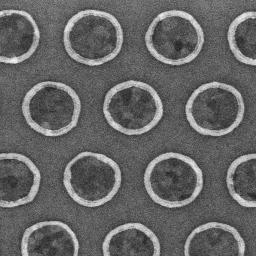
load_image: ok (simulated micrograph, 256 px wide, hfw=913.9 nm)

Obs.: raised bodies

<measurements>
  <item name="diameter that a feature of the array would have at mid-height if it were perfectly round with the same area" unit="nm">191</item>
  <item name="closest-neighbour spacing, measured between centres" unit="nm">290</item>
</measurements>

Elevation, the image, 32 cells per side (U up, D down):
DDDDDDDDDDDDDDDDDDDDDDDDDDDDDDDD
DDDDDDDDDDDDDDDDDDDDDDDDDDDDDDDD
UUUUDDDDDUUUUUDDDDDDUUUUDDDDDDUU
UUUUUDDDUUUUUUUDDDDUUUUUUDDDDUUU
UUUUUDDDUUUUUUUDDDDUUUUUUDDDDUUU
UUUUDDDDUUUUUUUDDDDUUUUUUDDDDUUU
UUUUDDDDDUUUUUUDDDDUUUUUUDDDDUUU
UUUDDDDDDDUUUDDDDDDDUUUDDDDDDDUU
DDDDDDDDDDDDDDDDDDDDDDDDDDDDDDDD
DDDDDDDDDDDDDDDDDDDDDDDDDDDDDDDD
DDDDDUUDDDDDDDDDUDDDDDDDDDDDDDDD
DDDDUUUUUDDDDDUUUUUDDDDDDUUUUDDD
DDDUUUUUUUDDDUUUUUUUDDDDUUUUUUDD
DDDUUUUUUUDDDUUUUUUUDDDDUUUUUUDD
DDDUUUUUUUDDDUUUUUUUDDDDUUUUUUDD
DDDDUUUUUDDDDDUUUUUDDDDDUUUUUUDD
DDDDDUUUDDDDDDDDUDDDDDDDDUUUDDDD
DDDDDDDDDDDDDDDDDDDDDDDDDDDDDDDD
DDDDDDDDDDDDDDDDDDDDDDDDDDDDDDDD
UUDDDDDDDDUUDDDDDDDDDUDDDDDDDDDD
UUUUDDDDDUUUUUDDDDDUUUUUDDDDDUUU
UUUUUDDDUUUUUUUDDDUUUUUUUDDDDUUU
UUUUUDDDUUUUUUUDDDUUUUUUUDDDDUUU
UUUUUDDDDUUUUUUDDDUUUUUUUDDDDUUU
UUUUDDDDDUUUUUDDDDDUUUUUDDDDDUUU
UUDDDDDDDDDUDDDDDDDDDUUDDDDDDDDU
DDDDDDDDDDDDDDDDDDDDDDDDDDDDDDDD
DDDDDDDDDDDDDDDDDDDDDDDDDDDDDDDD
DDDDUUUUDDDDDDDUUUDDDDDDDUUUUDDD
DDDUUUUUUDDDDDUUUUUDDDDDUUUUUUDD
DDDUUUUUUDDDDUUUUUUUDDDUUUUUUUDD
DDDUUUUUUDDDDUUUUUUUDDDUUUUUUUDD